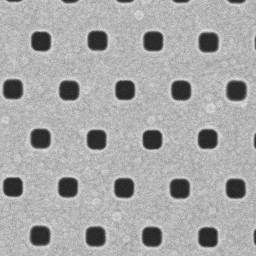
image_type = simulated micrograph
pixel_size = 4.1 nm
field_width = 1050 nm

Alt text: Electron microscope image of a regular array of holes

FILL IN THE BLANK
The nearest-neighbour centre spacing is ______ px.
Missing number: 55.4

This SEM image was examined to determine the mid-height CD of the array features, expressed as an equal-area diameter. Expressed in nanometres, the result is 83.5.